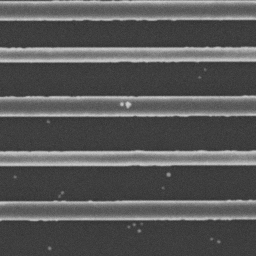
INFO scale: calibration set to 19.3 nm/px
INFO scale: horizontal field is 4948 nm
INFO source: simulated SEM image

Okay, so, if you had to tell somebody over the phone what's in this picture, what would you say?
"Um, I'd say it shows lines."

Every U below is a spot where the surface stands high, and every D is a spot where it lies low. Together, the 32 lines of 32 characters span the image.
UUUUUUUUUUUUUUUUUUUUUUUUUUUUUUUU
UUUUUUUUUUUUUUUUUUUUUUUUUUUUUUUU
UUUUUUUUUUUUUUUUDUUUDDDDDDDDDDDD
DDDDDDDDDDDDDDDDDDDDDDDDDDDDDDDD
DDDDDDDDDDDDDDDDDDDDDDDDDDDDDDDD
DDDDDDDDDDDDDDDDDDDDDDDDDDDDDDDD
UUUUUUUUUUUUUUUUUUUUUUUUUUUUUUUU
UUUUUUUUUUUUUUUUUUUUUUUUUUUUUUUU
DDDDDDDDDDDDDDDDDDDDDDDDDDDDDDDD
DDDDDDDDDDDDDDDDDDDDDDDDDDDDDDDD
DDDDDDDDDDDDDDDDDDDDDDDDDDDDDDDD
DDDDDDDDDDDDDDDDDDDDDDDDDDDDDDDD
UUUUUUUUUUUUUUUUUUUUUUUUUUUUUUUU
UUUUUUUUUUUUUUUUUUUUUUUUUUUUUUUU
DDDDDDDDDDDDDDDDDDDDDDDDDDDDDDDD
DDDDDDDDDDDDDDDDDDDDDDDDDDDDDDDD
DDDDDDDDDDDDDDDDDDDDDDDDDDDDDDDD
DDDDDDDDDDDDDDDDDDDDDDDDDDDDDDDD
DDDDDDDDDDDDDDDDDDDDDDDDDDDDDDDD
UUUUUUUUUUUUUUUUUUUUUUUUUUUUUUUU
UUUUUUUUUUUUUUUUUUUUUUUUUUDDDDDD
DDDDDDDDDDDDDDDDDDDDDDDDDDDDDDDD
DDDDDDDDDDDDDDDDDDDDDDDDDDDDDDDD
DDDDDDDDDDDDDDDDDDDDDDDDDDDDDDDD
DDDDDDDDDDDDDDDDDDDDDDDDDDDDDDDD
UUUUUUUUUUUUUUUUUUUUUUUUUUUUUUUU
UUUUUUUUUUUUUUUUUUUUUUUUUUUUUUUU
UDDDUUUDDDDDDDDDDDDDDDDDDDDDDDDD
DDDDDDDDDDDDDDDDDDDDDDDDDDDDDDDD
DDDDDDDDDDDDDDDDDDDDDDDDDDDDDDDD
DDDDDDDDDDDDDDDDDDDDDDDDDDDDDDDD
DDDDDDDDDDDDDDDDDDDDDDDDDDDDDDDD